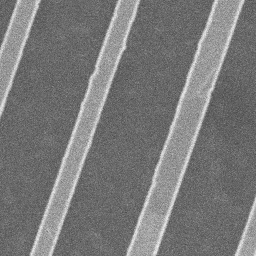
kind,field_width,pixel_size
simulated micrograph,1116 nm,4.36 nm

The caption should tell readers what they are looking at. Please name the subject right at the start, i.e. one or a few lines or trenches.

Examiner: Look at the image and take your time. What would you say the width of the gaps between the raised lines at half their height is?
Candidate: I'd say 318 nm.